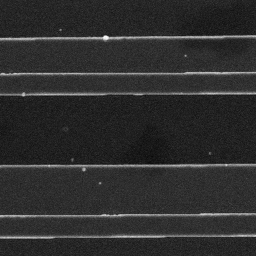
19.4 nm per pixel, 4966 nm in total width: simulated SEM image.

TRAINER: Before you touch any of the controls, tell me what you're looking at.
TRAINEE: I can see lines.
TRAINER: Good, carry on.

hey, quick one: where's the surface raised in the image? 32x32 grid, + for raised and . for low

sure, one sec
................................
................................
................................
................................
................................
++++++++++++++++++++++++++++++++
++++++++++++++++++++++++++++++++
++++++++++++++++++++++++++++++++
++++++++++++++++++++++++++++++++
++++++++++++++++++++++++++++++++
++++++++++++++++++++++++++++++++
++++++++++++++++++++++++++++++++
................................
................................
................................
................................
................................
................................
................................
................................
................................
++++++++++++++++++++++++++++++++
++++++++++++++++++++++++++++++++
++++++++++++++++++++++++++++++++
++++++++++++++++++++++++++++++++
++++++++++++++++++++++++++++++++
++++++++++++++++++++++++++++++++
++++++++++++++++++++++++++++++++
++++++++++++++++++++++++++++++++
++++++++++++++++++++++++++++++++
................................
................................